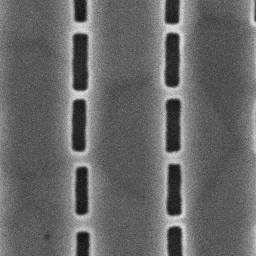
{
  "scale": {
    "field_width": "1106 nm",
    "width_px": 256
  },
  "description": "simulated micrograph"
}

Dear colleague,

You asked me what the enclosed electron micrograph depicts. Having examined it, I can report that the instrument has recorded holes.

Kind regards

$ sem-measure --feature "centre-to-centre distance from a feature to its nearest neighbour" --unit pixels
64.6